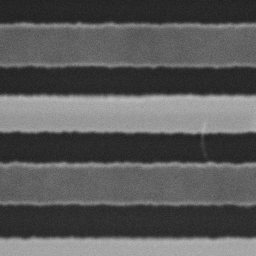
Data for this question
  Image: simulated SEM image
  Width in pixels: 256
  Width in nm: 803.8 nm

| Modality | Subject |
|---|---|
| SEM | lines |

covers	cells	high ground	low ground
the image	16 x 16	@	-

----------------
@@@@@@@@@@@@@-@@
@@@@@@@@@@@@@@@@
@@@@@@@@@@@@@@@@
----------------
----------------
@@@@@@@@@@@@@@@@
@@@@@@@@@@@@@@@@
----------------
----------------
@@@@@@@@@@@@@@@@
@@@@@@@@@@@@@@@@
@@@@@@@@@@@@@@@@
----------------
----------------
@@@@@@@@@@@@@@@@